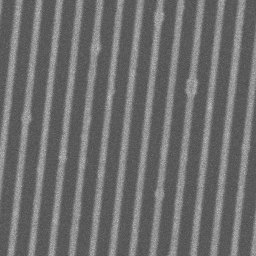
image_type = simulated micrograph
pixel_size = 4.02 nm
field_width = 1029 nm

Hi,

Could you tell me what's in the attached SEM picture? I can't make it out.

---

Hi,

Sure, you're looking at parallel lines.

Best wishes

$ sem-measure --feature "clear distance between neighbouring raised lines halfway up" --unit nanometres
60.5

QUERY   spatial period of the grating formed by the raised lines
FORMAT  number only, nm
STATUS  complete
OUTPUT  81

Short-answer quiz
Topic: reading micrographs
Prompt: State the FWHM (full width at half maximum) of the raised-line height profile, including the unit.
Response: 18 nanometers